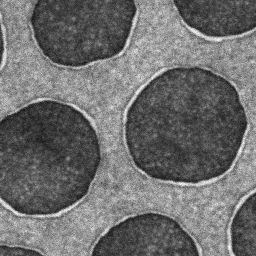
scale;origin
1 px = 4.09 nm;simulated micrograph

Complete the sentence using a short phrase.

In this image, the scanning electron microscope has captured holes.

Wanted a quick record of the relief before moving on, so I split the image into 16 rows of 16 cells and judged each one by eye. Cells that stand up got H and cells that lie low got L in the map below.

HHLLLLLLLHHLLLLL
HHLLLLLLHHHHLLLL
HHLLLLLLHHHHHHHH
HHHLLLLHHHHHHHHH
HHHHHHHHHHLLLHHH
HHHHHHHHHLLLLLLH
HHLLHHHHLLLLLLLH
LLLLLLHHLLLLLLLH
LLLLLLHHLLLLLLLH
LLLLLLHHLLLLLLLH
LLLLLLHHHLLLLLHH
LLLLLLHHHHHHHHHH
LLLLLHHHHHHHHHHL
HHHHHHHHLLHHHHHL
HHHHHHHLLLLLHHLL
LLHHHHLLLLLLHHLL